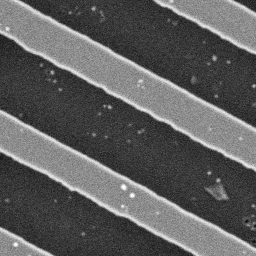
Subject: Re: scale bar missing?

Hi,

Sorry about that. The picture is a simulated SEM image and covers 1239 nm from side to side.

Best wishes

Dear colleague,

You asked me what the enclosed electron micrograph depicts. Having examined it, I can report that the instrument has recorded lines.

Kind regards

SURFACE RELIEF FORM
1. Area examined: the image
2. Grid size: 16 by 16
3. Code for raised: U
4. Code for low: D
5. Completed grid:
UUDDDDDDDDUUUUUD
UUUUDDDDDDDDUUUU
DUUUUUDDDDDDDDUU
DDUUUUUUDDDDDDDD
DDDDUUUUUDDDDDDD
DDDDDDUUUUUDDDDD
DDDDDDDDUUUUUDDD
UDDDDDDDDDUUUUUD
UUUDDDDDDDDDUUUU
UUUUUDDDDDDDDDUU
DDUUUUUDDDDDDDDD
DDDDUUUUUDDDDDDD
DDDDDDUUUUDDDDDD
DDDDDDDDUUUUDDDD
UDDDDDDDDUUUUUDD
UUDDDDDDDDDUUUUU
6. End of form